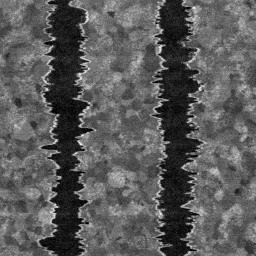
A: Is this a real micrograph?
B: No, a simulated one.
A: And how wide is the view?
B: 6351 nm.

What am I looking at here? one or a few lines or trenches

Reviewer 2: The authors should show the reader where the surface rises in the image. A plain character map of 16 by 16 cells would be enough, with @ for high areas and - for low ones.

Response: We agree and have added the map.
@@@--@@@@@--@@@@
@@@--@@@@@--@@@@
@@@--@@@@@--@@@@
@@@--@@@@@--@@@@
@@@--@@@@@--@@@@
@@@--@@@@@--@@@@
@@@--@@@@@--@@@@
@@@--@@@@@--@@@@
@@@--@@@@@--@@@@
@@@--@@@@@--@@@@
@@@--@@@@@--@@@@
@@@--@@@@@--@@@@
@@@--@@@@@--@@@@
@@@--@@@@@--@@@@
@@@--@@@@@--@@@@
@@@--@@@@@--@@@@